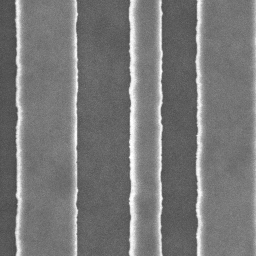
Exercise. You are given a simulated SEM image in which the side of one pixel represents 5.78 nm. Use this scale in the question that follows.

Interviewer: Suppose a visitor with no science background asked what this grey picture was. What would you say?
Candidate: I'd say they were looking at lines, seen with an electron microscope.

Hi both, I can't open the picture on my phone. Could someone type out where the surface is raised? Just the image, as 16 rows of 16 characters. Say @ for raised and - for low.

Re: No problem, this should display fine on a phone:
-@@@@---@@--@@@@
-@@@@---@@--@@@@
-@@@@---@@--@@@@
-@@@@---@@--@@@@
-@@@@---@@--@@@@
-@@@@---@@--@@@@
-@@@@---@@--@@@@
-@@@@---@@--@@@@
-@@@@---@@--@@@@
-@@@@---@@--@@@@
-@@@@---@@--@@@@
-@@@@---@@--@@@@
-@@@@---@@--@@@@
-@@@@---@@--@@@@
-@@@@---@@--@@@@
-@@@@---@@--@@@@